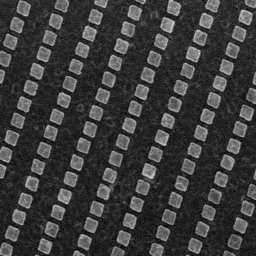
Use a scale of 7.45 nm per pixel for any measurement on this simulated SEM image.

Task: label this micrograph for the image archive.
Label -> a regular array of raised bodies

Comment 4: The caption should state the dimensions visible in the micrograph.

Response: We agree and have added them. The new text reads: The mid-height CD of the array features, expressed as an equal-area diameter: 101 nm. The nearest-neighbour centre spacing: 132 nm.